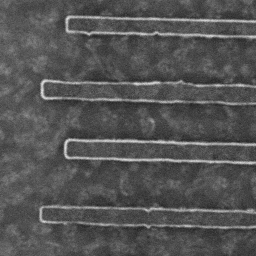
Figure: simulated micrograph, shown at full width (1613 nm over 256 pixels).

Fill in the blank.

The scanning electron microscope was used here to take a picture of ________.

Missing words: one or a few lines or trenches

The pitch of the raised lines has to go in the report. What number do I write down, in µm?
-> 0.401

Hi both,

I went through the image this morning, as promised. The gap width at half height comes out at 0.307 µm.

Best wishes